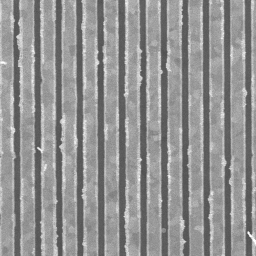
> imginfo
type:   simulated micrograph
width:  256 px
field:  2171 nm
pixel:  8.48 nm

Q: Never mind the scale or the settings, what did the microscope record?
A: parallel lines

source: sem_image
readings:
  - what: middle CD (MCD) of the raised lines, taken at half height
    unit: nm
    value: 120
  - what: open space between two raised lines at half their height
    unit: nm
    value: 59.4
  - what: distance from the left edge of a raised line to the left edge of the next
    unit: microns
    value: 0.179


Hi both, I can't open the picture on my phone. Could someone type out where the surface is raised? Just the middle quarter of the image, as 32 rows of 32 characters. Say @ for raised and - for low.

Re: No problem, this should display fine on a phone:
@@@--@@@--@@@---@@@--@@@--@@@--@
@@@--@@@--@@@---@@@--@@@--@@@--@
@@@--@@@--@@@---@@@--@@@--@@@--@
@@@--@@@--@@@--@@@@--@@@--@@@--@
@@@--@@@--@@@--@@@@--@@@--@@@--@
@@@--@@@--@@@--@@@@--@@@--@@@--@
@@@--@@@--@@@--@@@@--@@@--@@@--@
@@@--@@@--@@@--@@@@--@@@--@@@--@
@@@--@@@--@@@--@@@@--@@@--@@@--@
@@@--@@@--@@@---@@@--@@@--@@@--@
@@@--@@@--@@@---@@@--@@@--@@@--@
@@@--@@@--@@@@--@@@--@@@--@@@--@
@@@--@@@--@@@@--@@@--@@@--@@@--@
@@@--@@@--@@@@--@@@--@@@--@@@--@
@@@--@@@--@@@@-@@@@--@@@--@@@--@
@@@--@@@--@@@@-@@@@--@@@--@@@--@
@@@--@@@--@@@@-@@@@--@@@--@@@--@
@@@--@@@--@@@@--@@@--@@@--@@@--@
@@@--@@@--@@@@--@@@--@@@--@@@--@
@@@--@@@--@@@@--@@@--@@@--@@@--@
@@@--@@@--@@@@--@@@--@@@--@@@--@
@@@--@@@--@@@@--@@@--@@@--@@@--@
@@@--@@@--@@@@--@@@--@@@--@@@--@
@@@--@@@--@@@@--@@@--@@@--@@@--@
@@@--@@@--@@@@--@@@--@@@--@@@--@
@@@--@@@--@@@@--@@@--@@@--@@@--@
@@@--@@@--@@@@--@@@--@@@--@@@--@
@@@--@@@--@@@@--@@@--@@@--@@@--@
@@@--@@@--@@@---@@@--@@@--@@@--@
@@@--@@@--@@@---@@@--@@@--@@@--@
@@@--@@@--@@@--@@@@--@@@--@@@--@
@@@--@@@--@@@--@@@@--@@@--@@@--@